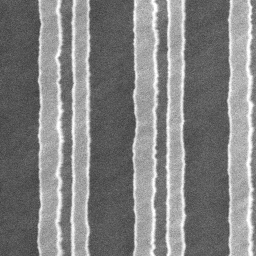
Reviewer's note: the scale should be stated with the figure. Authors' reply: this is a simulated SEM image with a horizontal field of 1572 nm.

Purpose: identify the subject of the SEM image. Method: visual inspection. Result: lines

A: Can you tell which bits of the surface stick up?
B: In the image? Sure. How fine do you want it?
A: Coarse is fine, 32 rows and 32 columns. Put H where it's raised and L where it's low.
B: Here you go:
LLLLLHHHHHHLLLLLLHHHHHHLLLLLLHHH
LLLLLHHHHHHLLLLLLHHHHHHLLLLLLHHH
LLLLLHHHHHHLLLLLLHHHHHHLLLLLLHHH
LLLLLHHHHHHLLLLLLHHHHHHLLLLLLHHH
LLLLLHHHHHHLLLLLLHHHHHHLLLLLLHHH
LLLLLHHHHHHLLLLLLHHHHHHLLLLLLHHH
LLLLLHHHHHHLLLLLLHHHHHHLLLLLLHHH
LLLLLHHHHHHLLLLLLHHHHHHLLLLLLHHH
LLLLLHHHHHHLLLLLLHHHHHHLLLLLLHHH
LLLLLHHHHHHLLLLLLHHHHHHLLLLLLHHH
LLLLLHHHHHHLLLLLLHHHHHHLLLLLLHHH
LLLLLHHHHHHLLLLLLHHHHHHLLLLLLHHH
LLLLLHHHHHHLLLLLLHHHHHHLLLLLLHHH
LLLLLHHHHHHLLLLLLHHHHHHLLLLLLHHH
LLLLLHHHHHHLLLLLLHHHHHHLLLLLLHHH
LLLLLHHHHHHLLLLLLHHHHHHLLLLLLHHH
LLLLLHHHHHHLLLLLLHHHHHHLLLLLLHHH
LLLLLHHHHHHLLLLLLHHHHHHLLLLLLHHH
LLLLLHHHHHHLLLLLLHHHHHHLLLLLLHHH
LLLLLHHHHHHLLLLLLHHHHHHLLLLLLHHH
LLLLLHHHHHHLLLLLLHHHHHHLLLLLLHHH
LLLLLHHHHHHLLLLLLHHHHHHLLLLLLHHH
LLLLLHHHHHHLLLLLLHHHHHHLLLLLLHHH
LLLLLHHHHHHLLLLLLHHHHHHLLLLLLHHH
LLLLLHHHHHHLLLLLLHHHHHHLLLLLLHHH
LLLLLHHHHHHLLLLLLHHHHHHLLLLLLHHH
LLLLLHHHHHHLLLLLLHHHHHHLLLLLLHHH
LLLLLHHHHHHLLLLLLHHHHHHLLLLLLHHH
LLLLLHHHHHHLLLLLLHHHHHHLLLLLLHHH
LLLLLHHHHHHLLLLLLHHHHHHLLLLLLHHH
LLLLLHHHHHHLLLLLLHHHHHHLLLLLLHHH
LLLLLHHHHHHLLLLLLHHHHHHLLLLLLHHH